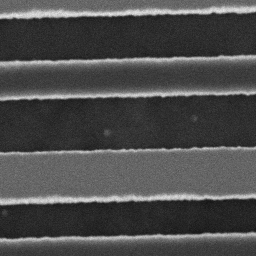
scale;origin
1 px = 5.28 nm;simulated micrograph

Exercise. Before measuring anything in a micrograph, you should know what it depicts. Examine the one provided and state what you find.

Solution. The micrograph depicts lines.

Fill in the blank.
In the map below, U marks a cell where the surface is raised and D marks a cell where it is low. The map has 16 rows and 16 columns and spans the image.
UUUUUUUUUUUUUUUU
DDDDDDDDDDDDDDDD
DDDDDDDDDDDDDDDD
DDDDDDDDDDDDDDDU
UUUUUUUUUUUUUUUU
UUUUUUUUUUUUUUUU
DDDDDDDDDDDDDDDD
DDDDDDDDDDDDDDDD
DDDDDDDDDDDDDDDD
DDDUUUUUUUUUUUUU
UUUUUUUUUUUUUUUU
UUUUUUUUUUUUUUUU
UUUUUUUUUUDDDDDD
DDDDDDDDDDDDDDDD
DDDDDDDDDDDDDDDD
UUUUUUUUUUUUUUUU